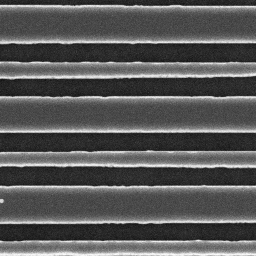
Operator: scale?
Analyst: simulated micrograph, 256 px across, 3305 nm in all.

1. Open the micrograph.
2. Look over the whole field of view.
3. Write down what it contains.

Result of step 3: lines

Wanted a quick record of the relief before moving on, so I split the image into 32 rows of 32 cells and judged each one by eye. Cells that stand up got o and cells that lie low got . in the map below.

................................
oooooooooooooooooooooooooooooooo
oooooooooooooooooooooooooooooooo
oooooooooooooooooooooooooooooooo
oooooooooooooooooooooooooooooooo
................................
................................
................................
oooooooooooooooooooooooooooooooo
ooooooooooooooooooooooooooooooo.
................................
................................
oooooooooooooooooooooooooooooooo
oooooooooooooooooooooooooooooooo
oooooooooooooooooooooooooooooooo
oooooooooooooooooooooooooooooooo
oooooooooooooooooooooooooooooooo
................................
................................
oooooooooooooooooooooooooooooooo
oooooooooooooooooooooooooooooooo
................................
................................
oooooooooooooooooooooooooooooooo
oooooooooooooooooooooooooooooooo
oooooooooooooooooooooooooooooooo
oooooooooooooooooooooooooooooooo
oooooooooooooooooooooooooooooooo
................................
................................
oooooooooooooooooooooooooooooooo
oooooooooooooooooooooooooooooooo